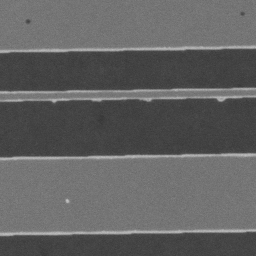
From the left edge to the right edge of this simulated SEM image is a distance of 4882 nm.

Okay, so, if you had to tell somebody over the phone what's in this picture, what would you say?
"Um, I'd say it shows lines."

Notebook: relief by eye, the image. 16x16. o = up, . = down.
oooooooooooooooo
oooooooooooooooo
oooooooooooooooo
................
................
................
................
................
................
................
oooooooooooooooo
oooooooooooooooo
oooooooooooooooo
oooooooooooooooo
ooooooooooo.....
................